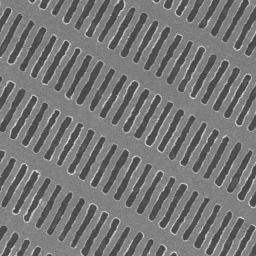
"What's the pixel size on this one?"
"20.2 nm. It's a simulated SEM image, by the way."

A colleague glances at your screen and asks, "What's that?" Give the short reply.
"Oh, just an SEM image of a regular array of holes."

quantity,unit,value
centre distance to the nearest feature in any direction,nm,269